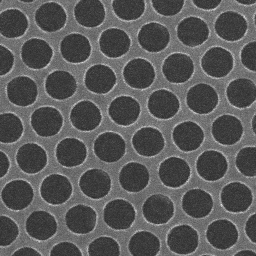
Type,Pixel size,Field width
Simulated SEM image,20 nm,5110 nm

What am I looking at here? a regular array of holes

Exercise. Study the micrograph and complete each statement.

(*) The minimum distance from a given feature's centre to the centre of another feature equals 0.771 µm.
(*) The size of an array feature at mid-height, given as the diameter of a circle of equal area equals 621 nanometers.